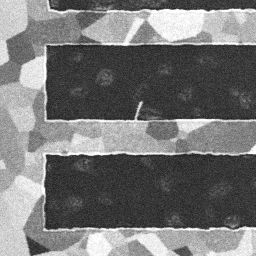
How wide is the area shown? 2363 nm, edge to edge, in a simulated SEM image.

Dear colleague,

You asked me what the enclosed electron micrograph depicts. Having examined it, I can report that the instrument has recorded one or a few lines or trenches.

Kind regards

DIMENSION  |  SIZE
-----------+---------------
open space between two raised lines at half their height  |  701 nm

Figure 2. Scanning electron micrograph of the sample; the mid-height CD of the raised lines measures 0.302 um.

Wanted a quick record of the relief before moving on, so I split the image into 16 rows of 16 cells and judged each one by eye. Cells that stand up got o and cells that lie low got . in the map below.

ooo.............
oooooooooooooooo
oooooooooooooooo
ooo.............
ooo.............
ooo.............
ooo.............
ooo.............
oooooooooooooooo
oooooooooooooooo
ooo.............
ooo.............
ooo.............
ooo.............
oooooooooooooooo
oooooooooooooooo